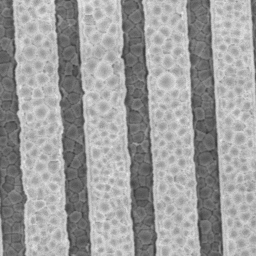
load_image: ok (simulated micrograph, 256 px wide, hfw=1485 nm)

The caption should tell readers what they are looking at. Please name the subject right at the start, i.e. one or a few lines or trenches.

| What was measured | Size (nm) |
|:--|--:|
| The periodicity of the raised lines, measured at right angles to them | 379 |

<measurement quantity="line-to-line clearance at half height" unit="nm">145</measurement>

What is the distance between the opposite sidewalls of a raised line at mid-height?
0.227 µm